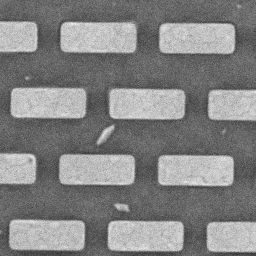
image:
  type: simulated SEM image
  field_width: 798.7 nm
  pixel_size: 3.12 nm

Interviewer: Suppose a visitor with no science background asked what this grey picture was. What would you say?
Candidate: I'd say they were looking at groups of lines, slits or small figures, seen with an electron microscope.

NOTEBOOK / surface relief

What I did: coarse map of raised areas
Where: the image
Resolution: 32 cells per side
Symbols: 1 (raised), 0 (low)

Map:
00000000000000000000000000000000
00000000000000000000000000000000
00000000000000000000000000000000
11111000111111111000111111111000
11111000111111111000111111111000
11111000111111111000111111111000
00000000000000000000111111111000
00000000000000000000000000000000
00000000000000000000000000000000
00000000000000000000000000000000
00000000000000000000000000000000
00111111111000111111111000111111
01111111111000111111111000111111
01111111111000111111111000111111
00111111110000111111111000111111
00000000000000000000000000000000
00000000000000000000000000000000
00000000000000000000000000000000
00000000000000000000000000000000
11110000111111110000111100000000
11110000111111111000111111111000
11110000111111111000111111111000
11110000111111111000111111111000
00000000000000000000000000000000
00000000000000000000000000000000
00000000000000000000000000000000
00000000000000000000000000000000
00000000000000000000000000000000
01111111111000111111111000111111
01111111111000111111111000111111
01111111111000111111111000111111
00000000000000000000000000000000